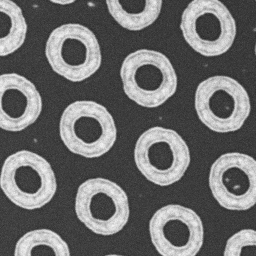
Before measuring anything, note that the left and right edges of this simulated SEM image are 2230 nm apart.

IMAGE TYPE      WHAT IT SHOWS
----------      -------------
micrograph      ring-shaped raised bodies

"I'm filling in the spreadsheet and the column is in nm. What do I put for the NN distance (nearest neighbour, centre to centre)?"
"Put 681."